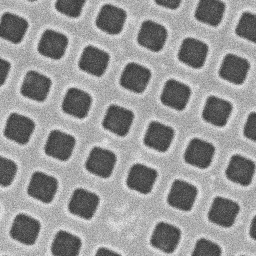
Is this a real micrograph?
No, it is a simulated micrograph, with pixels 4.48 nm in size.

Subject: a regular array of holes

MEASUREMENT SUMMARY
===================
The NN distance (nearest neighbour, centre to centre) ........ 0.197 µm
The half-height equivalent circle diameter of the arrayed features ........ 143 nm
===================